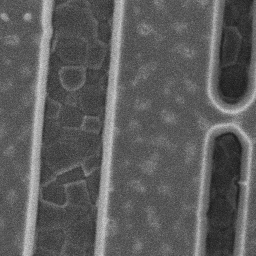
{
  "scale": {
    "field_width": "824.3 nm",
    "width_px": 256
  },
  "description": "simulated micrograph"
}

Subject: one or a few lines or trenches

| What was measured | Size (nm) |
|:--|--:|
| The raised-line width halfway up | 323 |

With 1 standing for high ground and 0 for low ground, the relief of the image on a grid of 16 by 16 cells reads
1110000111111100
1110000111111100
1110000111111100
1110000111111000
1110000111111000
1110000111111000
1110000111111101
1100000111111111
1100000111111001
1100000111111001
1100000111111001
1100000111111001
1100001111111001
1100001111111001
1100001111111001
1100001111111001